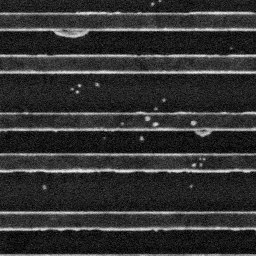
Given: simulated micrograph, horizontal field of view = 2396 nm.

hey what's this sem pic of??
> lines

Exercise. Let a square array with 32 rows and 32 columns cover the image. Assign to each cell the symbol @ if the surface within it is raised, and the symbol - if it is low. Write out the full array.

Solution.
--------------------------------
--------------------------------
@@@@@@@@@@@@@@@@@@@@@@@@@@@@@@@@
@@@@@@@@@@@@@@@@@@@@@@@@@@@@@@@@
--------------------------------
--------------------------------
--------------------------------
@@@@@@@@@@@@@@@@@@@@@@@@@@@@@@@@
@@@@@@@@@@@@@@@@@@@@@@@@@@@@@@@@
--------------------------------
--------------------------------
--------------------------------
--------------------------------
--------------------------------
@@@@@@@@@@@@@@@@@@@@@@@@@@@@@@@@
@@@@@@@@@@@@@@@@@@@@@@@@@@@@@@@@
-------------------------@------
--------------------------------
--------------------------------
@@@@@@@@@@@@@@@@@@@@@@@@@@@@@@@@
@@@@@@@@@@@@@@@@@@@@@@@@@@@@@@@@
--------------------------------
--------------------------------
--------------------------------
--------------------------------
--------------------------------
--------------------------------
@@@@@@@@@@@@@@@@@@@@@@@@@@@@@@@@
@@@@@@@@@@@@@@@@@@@@@@@@@@@@@@@@
--------------------------------
--------------------------------
--------------------------------